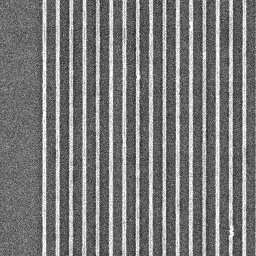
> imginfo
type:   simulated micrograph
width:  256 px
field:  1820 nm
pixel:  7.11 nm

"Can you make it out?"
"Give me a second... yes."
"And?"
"parallel lines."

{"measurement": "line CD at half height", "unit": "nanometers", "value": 17.8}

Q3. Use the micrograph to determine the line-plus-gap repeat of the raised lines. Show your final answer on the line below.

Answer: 94.6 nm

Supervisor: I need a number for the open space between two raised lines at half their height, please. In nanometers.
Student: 78.2